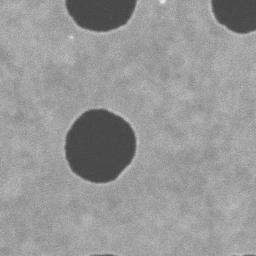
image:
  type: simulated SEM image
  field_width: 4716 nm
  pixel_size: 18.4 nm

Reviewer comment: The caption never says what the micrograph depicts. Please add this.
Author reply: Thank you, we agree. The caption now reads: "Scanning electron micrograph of holes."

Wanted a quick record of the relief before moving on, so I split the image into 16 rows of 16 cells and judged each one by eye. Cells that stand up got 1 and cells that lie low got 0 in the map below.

1111000011111000
1111100011111100
1111111111111111
1111111111111111
1111111111111111
1111111111111111
1111111111111111
1111100011111111
1111000011111111
1111000011111111
1111000011111111
1111111111111111
1111111111111111
1111111111111111
1111111111111111
1111111111111111